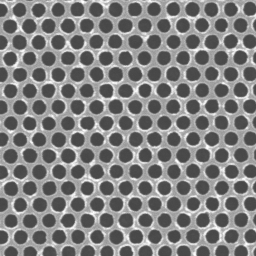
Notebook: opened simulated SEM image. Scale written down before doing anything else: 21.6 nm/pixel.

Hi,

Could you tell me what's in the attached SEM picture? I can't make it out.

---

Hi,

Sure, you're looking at a regular array of holes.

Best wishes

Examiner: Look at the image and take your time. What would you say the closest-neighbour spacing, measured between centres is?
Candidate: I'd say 0.401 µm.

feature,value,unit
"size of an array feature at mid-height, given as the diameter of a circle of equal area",0.316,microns